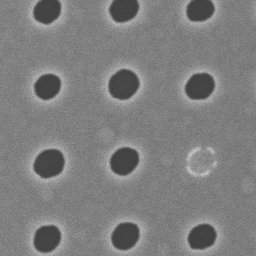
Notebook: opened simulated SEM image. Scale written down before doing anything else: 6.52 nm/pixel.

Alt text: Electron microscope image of a regular array of holes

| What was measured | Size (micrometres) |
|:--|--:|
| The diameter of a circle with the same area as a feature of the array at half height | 0.188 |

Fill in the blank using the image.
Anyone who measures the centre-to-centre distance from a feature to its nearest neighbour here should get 0.493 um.